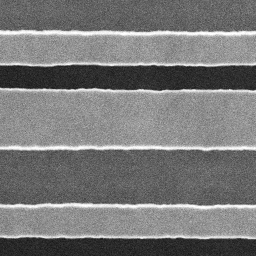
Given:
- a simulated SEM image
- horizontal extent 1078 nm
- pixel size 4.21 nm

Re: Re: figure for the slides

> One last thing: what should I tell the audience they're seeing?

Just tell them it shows lines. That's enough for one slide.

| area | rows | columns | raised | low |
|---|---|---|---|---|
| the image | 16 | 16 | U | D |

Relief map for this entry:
DDDDDDDDDDDDDDDD
DDDDDDDDDDDDDDDD
UUUUUUUUUUUUUUUU
UUUUUUUUUUUUUUUU
DDDDDDDDDDDDDDDD
DDDDDDDDDDDDDDDD
UUUUUUUUUUUUUUUU
UUUUUUUUUUUUUUUU
UUUUUUUUUUUUUUUU
DDDDDDDDDDDDDDDD
DDDDDDDDDDDDDDDD
DDDDDDDDDDDDDDDD
DDDDDDDDDDDDDDDD
UUUUUUUUUUUUUUUU
UUUUUUUUUUUUUUUU
DDDDDDDDDDDDDDDD